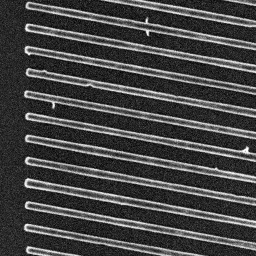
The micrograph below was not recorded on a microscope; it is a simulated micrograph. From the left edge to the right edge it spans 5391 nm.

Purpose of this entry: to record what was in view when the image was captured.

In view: parallel lines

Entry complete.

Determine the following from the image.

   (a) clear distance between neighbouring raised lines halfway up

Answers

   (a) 0.321 microns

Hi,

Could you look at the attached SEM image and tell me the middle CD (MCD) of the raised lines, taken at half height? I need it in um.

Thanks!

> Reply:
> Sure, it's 0.142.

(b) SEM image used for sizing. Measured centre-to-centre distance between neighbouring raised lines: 0.461 microns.